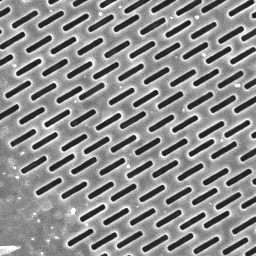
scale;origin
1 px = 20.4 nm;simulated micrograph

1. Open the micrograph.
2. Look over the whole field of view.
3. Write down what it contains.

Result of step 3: a regular array of holes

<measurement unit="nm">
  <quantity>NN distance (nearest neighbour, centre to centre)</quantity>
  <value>491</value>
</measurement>